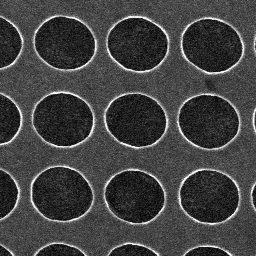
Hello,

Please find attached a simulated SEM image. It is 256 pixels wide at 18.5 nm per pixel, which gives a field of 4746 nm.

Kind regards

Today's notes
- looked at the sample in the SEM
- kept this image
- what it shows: a regular array of holes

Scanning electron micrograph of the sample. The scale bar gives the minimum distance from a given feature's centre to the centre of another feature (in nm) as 1350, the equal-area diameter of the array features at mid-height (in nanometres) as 1050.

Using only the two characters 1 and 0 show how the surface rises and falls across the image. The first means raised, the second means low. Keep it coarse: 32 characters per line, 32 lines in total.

11111111111111111111111111111111
11111111111111111111111111111111
01111100001111100011111110011111
00111000000111000000111000000111
00010000000011000000011000000011
00010000000010000000011000000011
00011000000011000000011000000011
00111000000111000000111100000011
11111110001111110001111110000111
11111111111111111111111111111111
11111111111111111111111111111111
11111111111111111111111111111111
01111000001111000001111100001111
00110000000110000000111000000111
00010000000010000000010000000011
00010000000010000000010000000011
00111000000111000000011000000011
01111100001111100000111100000111
11111111111111111111111111011111
11111111111111111111111111111111
11111111111111111111111111111111
01111000001111100011111100011111
00110000000111000000111000000111
00110000000110000000111000000011
00110000000010000000011000000010
00110000000110000000111000000011
01111000000111000000111000000111
11111110011111100001111110001111
11111111111111111111111111111111
11111111111111111111111111111111
11111110111111111111111111111111
01111000001111000001111100001111